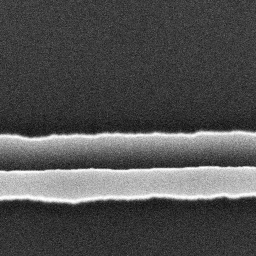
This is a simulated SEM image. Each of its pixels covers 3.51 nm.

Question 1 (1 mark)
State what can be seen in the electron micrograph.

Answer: lines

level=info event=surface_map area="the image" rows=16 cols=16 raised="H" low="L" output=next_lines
LLLLLLLLLLLLLLLL
LLLLLLLLLLLLLLLL
LLLLLLLLLLLLLLLL
LLLLLLLLLLLLLLLL
LLLLLLLLLLLLLLLL
LLLLLLLLLLLLLLLL
LLLLLLLLLLLLLLLL
LLLLLLLLLLLLLLLL
LLLLLLHHLHHHHHHH
HHHHHHHHHHHHHHHH
HHHHHHHHHHHHHHHH
HHHHHHHHHHHHHHHH
LLLHHLLLLLLLLLLL
LLLLLLLLLLLLLLLL
LLLLLLLLLLLLLLLL
LLLLLLLLLLLLLLLL